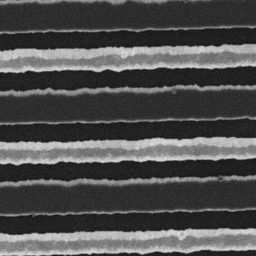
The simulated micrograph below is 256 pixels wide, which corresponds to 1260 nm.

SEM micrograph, lines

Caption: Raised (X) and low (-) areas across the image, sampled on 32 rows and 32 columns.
XXXXXXXXXXXXXXXXXXXXXXXXXXXXXXXX
XXXXXXXXXXXXXXXXXXXXXXXXXXXXXXXX
XXXXXXXXXXXXXXXXXXXXXXXXXXXXXXXX
XXXXXXXXXXXXXXXXXXXXXXXXXX------
--------------------------------
--------------------------------
--XXX--XXXXXXXXXXXXXXXXXXXXXXXXX
XXXXXXXXXXXXXXXXXXXXXXXXXXXXXXXX
XXXXXXXXXXXXXXXXXXX-------------
--------------------------------
--------------------------------
-X--XXXXXXXXXXXXXXXXXXXXXXXXXXXX
XXXXXXXXXXXXXXXXXXXXXXXXXXXXXXXX
XXXXXXXXXXXXXXXXXXXXXXXXXXXXXXXX
XXXXXXXXXXXXXXXXXXXXXXXXXXXXXXXX
XX------------------------------
--------------------------------
--------------------------------
XXXXXXXXXXXXXXXXXXXXXXXXXXXXXXXX
XXXXXXXXXXXXXXXXXXXXXXXXXXXXXXXX
--------------------------------
--------------------------------
----------X-----XXXXXXXXXXXXXXXX
XXXXXXXXXXXXXXXXXXXXXXXXXXXXXXXX
XXXXXXXXXXXXXXXXXXXXXXXXXXXXXXXX
XXXXXXXXXXXXXXXXXXXXXXXXXXXXXXXX
XXXXXXXXXXXXXXXXXXXXXX-X--------
--------------------------------
--------------------------------
------X--XXXXXXXXXXXXXXXXXXXXXXX
XXXXXXXXXXXXXXXXXXXXXXXXXXXXXXXX
XXXXXXXXXXXXXXXXXXX----X--------